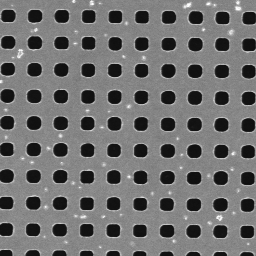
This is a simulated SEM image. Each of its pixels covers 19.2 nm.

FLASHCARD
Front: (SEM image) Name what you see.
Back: a regular array of holes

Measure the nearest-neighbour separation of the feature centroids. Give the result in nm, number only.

505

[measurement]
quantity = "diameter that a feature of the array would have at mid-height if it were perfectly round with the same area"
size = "283 nm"